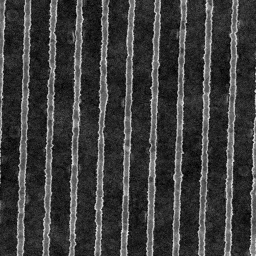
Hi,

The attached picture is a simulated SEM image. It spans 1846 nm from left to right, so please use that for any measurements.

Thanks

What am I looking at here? parallel lines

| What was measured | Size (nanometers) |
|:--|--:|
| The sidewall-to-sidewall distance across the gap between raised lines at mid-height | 146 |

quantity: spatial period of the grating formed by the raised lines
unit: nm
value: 187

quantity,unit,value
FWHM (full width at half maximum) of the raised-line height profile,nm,40.5